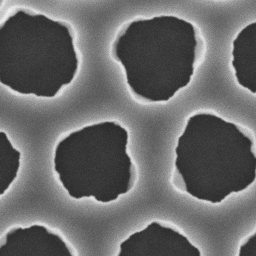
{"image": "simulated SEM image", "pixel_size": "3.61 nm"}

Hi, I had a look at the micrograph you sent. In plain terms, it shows holes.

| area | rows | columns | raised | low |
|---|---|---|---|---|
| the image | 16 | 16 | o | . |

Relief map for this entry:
oooooooooooooooo
....oooo....oooo
.....oo.....ooo.
.....oo.....ooo.
.....ooo....ooo.
o...oooo...oooo.
oooooooooooooooo
oooooooooooo..oo
oooo....ooo.....
.oo.....ooo.....
.ooo....ooo.....
.ooo....ooo.....
oooooo.oooooo.oo
oooooooooooooooo
o..oooooo..ooooo
....oooo....ooo.